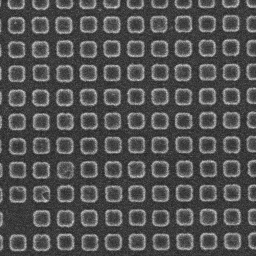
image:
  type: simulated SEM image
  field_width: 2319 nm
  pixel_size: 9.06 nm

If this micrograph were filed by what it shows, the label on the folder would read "a regular array of raised bodies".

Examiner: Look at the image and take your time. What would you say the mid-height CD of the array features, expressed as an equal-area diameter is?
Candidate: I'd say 0.156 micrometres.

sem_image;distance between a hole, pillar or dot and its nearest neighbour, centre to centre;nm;213